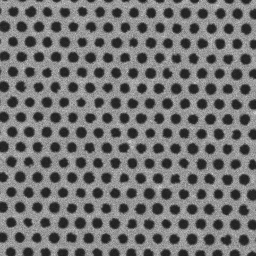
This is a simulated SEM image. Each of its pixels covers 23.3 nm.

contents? a regular array of holes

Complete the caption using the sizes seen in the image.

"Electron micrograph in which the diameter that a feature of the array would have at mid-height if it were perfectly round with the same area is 248 nm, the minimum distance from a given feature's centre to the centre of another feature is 394 nm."